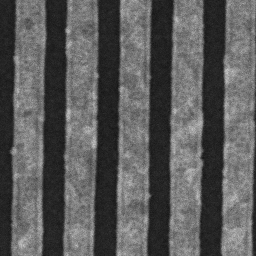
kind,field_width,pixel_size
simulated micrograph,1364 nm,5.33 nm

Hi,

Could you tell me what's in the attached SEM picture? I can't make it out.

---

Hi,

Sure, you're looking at parallel lines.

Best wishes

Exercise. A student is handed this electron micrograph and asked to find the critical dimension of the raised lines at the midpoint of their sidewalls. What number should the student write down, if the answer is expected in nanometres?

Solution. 155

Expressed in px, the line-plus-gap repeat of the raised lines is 52.6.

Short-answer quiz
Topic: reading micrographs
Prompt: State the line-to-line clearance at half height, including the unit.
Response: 122 nm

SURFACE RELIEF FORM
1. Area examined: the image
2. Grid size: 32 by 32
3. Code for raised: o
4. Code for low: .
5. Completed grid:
..oooo...ooo...oooo...ooo...oooo
..oooo..oooo...oooo...ooo...oooo
..oooo..oooo...oooo...ooo...oooo
..oooo..oooo...oooo...ooo...oooo
..oooo..oooo...oooo...ooo...oooo
..oooo..oooo...oooo...ooo...oooo
..oooo..oooo...oooo...ooo...oooo
..ooo...oooo...oooo...ooo...oooo
..ooo...oooo...oooo...ooo...oooo
..ooo...oooo...oooo..oooo...oooo
..ooo...oooo...oooo...ooo...oooo
..ooo...oooo...oooo...ooo...oooo
..ooo...oooo...oooo...ooo...oooo
..ooo...oooo...oooo..oooo...oooo
..ooo...oooo...oooo..oooo...oooo
..ooo...oooo...oooo..oooo...oooo
..ooo...oooo...ooo...oooo...oooo
..ooo...oooo...oooo..oooo...oooo
..ooo...oooo...oooo..oooo...oooo
.oooo...oooo...oooo..oooo...oooo
..ooo...oooo...oooo..oooo...oooo
..ooo...oooo...ooo...oooo...oooo
..ooo...oooo...oooo..oooo...ooo.
..ooo...oooo...oooo..oooo...oooo
..ooo...oooo...oooo..oooo...oooo
..ooo...oooo...ooo...oooo...oooo
.oooo...oooo...ooo...oooo...ooo.
.oooo...oooo...ooo...oooo...ooo.
..ooo...oooo...ooo...oooo...ooo.
..ooo...oooo...ooo...oooo...ooo.
..ooo...oooo...ooo...oooo...ooo.
..ooo...oooo...ooo...oooo...ooo.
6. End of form